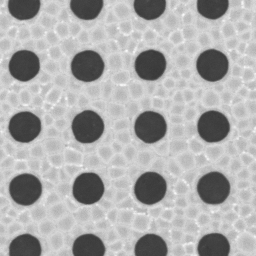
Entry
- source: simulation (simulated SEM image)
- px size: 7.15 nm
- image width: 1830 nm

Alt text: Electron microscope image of a regular array of holes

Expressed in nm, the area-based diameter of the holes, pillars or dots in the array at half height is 228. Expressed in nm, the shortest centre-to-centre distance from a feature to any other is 439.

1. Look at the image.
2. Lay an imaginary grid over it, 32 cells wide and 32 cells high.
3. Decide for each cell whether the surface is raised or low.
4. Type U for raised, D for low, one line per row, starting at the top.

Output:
UDDDDUUUUDDDDUUUUDDDDUUUUDDDDUUU
UDDDDUUUUDDDDUUUUDDDDUUUUDDDUUUU
UUUUUUUUUUUUUUUUUUUUUUUUUUUUUUUU
UUUUUUUUUUUUUUUUUUUUUUUUUUUUUUUU
UUUUUUUUUUUUUUUUUUUUUUUUUUUUUUUU
UUUUUUUUUUUUUUUUUUUUUUUUUUUUUUUU
UUDDUUUUUUDDUUUUUUDDUUUUUDDDUUUU
UDDDDUUUUDDDDUUUUDDDDUUUUDDDDUUU
UDDDDUUUUDDDDUUUUDDDDUUUUDDDDUUU
UUDDUUUUUDDDUUUUUDDDUUUUUDDDUUUU
UUUUUUUUUUUUUUUUUUUUUUUUUUUUUUUU
UUUUUUUUUUUUUUUUUUUUUUUUUUUUUUUU
UUUUUUUUUUUUUUUUUUUUUUUUUUUUUUUU
UUUUUUUUUUUUUUUUUUUUUUUUUUUUUUUU
UUDDDUUUUUDDUUUUUDDDUUUUUDDDUUUU
UDDDDUUUUDDDDUUUUDDDDUUUUDDDDUUU
UDDDDUUUUDDDDUUUUDDDDUUUUDDDDUUU
UUDDUUUUUUDDUUUUUUDDUUUUUUDDUUUU
UUUUUUUUUUUUUUUUUUUUUUUUUUUUUUUU
UUUUUUUUUUUUUUUUUUUUUUUUUUUUUUUU
UUUUUUUUUUUUUUUUUUUUUUUUUUUUUUUU
UUUUUUUUUUUUUUUUUUUUUUUUUUUUUUUU
UUDDDUUUUDDDDUUUUDDDDUUUUDDDUUUU
UDDDDUUUUDDDDUUUUDDDDUUUUDDDDUUU
UDDDDUUUUDDDDUUUUDDDUUUUUDDDUUUU
UUDDUUUUUUUUUUUUUUUUUUUUUUDUUUUU
UUUUUUUUUUUUUUUUUUUUUUUUUUUUUUUU
UUUUUUUUUUUUUUUUUUUUUUUUUUUUUUUU
UUUUUUUUUUUUUUUUUUUUUUUUUUUUUUUU
UUDDUUUUUUDDUUUUUUDDUUUUUUDDUUUU
UDDDDUUUUDDDDUUUUDDDDUUUUDDDDUUU
UDDDDUUUUDDDDUUUUDDDDUUUUDDDDUUU